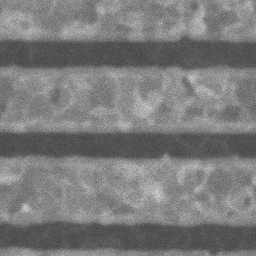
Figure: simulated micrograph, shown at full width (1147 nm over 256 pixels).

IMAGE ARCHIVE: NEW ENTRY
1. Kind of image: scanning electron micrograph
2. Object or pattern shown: one or a few lines or trenches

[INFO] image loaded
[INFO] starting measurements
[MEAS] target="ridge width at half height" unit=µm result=0.251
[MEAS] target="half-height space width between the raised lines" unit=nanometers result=157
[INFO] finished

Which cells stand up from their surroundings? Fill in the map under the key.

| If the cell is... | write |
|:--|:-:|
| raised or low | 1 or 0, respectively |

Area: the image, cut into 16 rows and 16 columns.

1111111111111111
1111111111111111
0000000000000000
0000000000000000
1000001111100100
1111111111111111
1111111111111111
1111111111111111
0000000000000000
0000000000000000
1111111111111111
1111111111111111
1111111111111111
1111111111111111
0000000000000000
0000000000000000